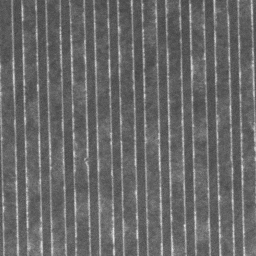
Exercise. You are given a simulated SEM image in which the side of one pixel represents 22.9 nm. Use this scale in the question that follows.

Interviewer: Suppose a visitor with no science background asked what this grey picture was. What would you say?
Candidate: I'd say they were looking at parallel lines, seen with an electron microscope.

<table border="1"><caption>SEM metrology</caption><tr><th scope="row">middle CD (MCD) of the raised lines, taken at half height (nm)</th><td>334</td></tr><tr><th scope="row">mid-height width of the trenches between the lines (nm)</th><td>223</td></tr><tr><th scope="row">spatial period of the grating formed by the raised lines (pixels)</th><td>24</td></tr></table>